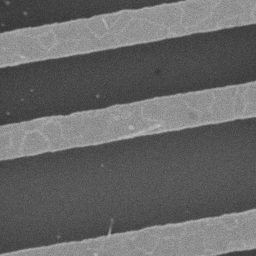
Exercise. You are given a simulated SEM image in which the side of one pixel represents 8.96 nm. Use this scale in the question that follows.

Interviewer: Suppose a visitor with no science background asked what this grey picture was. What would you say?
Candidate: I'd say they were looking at lines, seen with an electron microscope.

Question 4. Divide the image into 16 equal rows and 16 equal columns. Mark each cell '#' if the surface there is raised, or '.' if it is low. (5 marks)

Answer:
.........#######
...#############
##########......
####............
................
.............###
........########
..#############.
#########.......
###.............
................
................
................
..............##
........########
..##############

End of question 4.